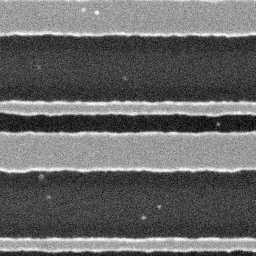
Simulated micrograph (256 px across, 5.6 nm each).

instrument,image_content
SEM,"lines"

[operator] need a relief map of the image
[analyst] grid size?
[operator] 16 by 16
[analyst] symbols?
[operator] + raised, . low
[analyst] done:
++++++++++++++++
++++++++++++++++
................
................
................
................
++++++++++++++++
++++++++++++++++
++++++++++++++++
++++++++++++++++
++++++++++++++++
................
................
................
................
++++++++++++++++